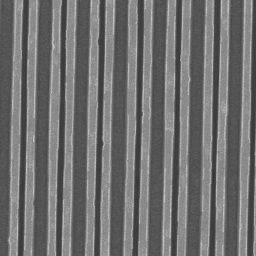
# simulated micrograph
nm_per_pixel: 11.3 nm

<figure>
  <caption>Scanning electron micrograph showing parallel lines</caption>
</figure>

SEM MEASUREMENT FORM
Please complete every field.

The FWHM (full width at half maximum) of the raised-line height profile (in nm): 123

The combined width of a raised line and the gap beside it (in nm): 217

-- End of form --